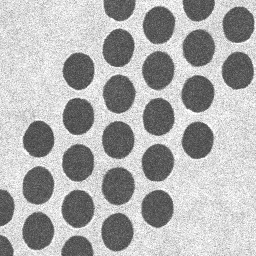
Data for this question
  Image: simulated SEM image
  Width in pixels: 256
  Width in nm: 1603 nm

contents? a regular array of holes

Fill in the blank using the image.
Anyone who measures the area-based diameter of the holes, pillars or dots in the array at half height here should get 0.216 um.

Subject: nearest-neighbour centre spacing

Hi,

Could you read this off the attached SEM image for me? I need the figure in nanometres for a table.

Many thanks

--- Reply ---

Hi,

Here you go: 285